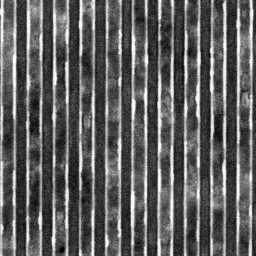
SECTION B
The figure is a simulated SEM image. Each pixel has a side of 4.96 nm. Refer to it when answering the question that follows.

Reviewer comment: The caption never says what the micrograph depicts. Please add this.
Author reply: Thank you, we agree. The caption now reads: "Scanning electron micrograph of parallel lines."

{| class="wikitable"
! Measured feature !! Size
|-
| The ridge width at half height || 72.6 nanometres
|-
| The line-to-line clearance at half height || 57.7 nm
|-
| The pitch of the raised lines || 26.3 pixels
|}